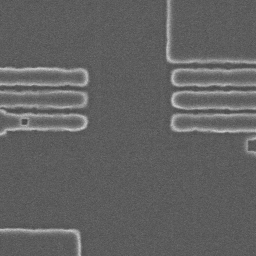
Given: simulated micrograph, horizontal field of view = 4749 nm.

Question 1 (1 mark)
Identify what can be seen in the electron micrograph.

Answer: wiring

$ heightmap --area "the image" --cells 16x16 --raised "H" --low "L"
LLLLLLLLLLLHHHHH
LLLLLLLLLLHHHHHH
LLLLLLLLLLHHHHHH
LLLLLLLLLLLHHHHH
HHHHHLLLLLLHHHHH
HHHHHLLLLLLHHHHH
HHHHHLLLLLLHHHHH
HHHHHLLLLLLHHHHH
LLLLLLLLLLLLLLLL
LLLLLLLLLLLLLLLL
LLLLLLLLLLLLLLLL
LLLLLLLLLLLLLLLL
LLLLLLLLLLLLLLLL
LLLLLLLLLLLLLLLL
HHHHHLLLLLLLLLLL
HHHHHLLLLLLLLLLL